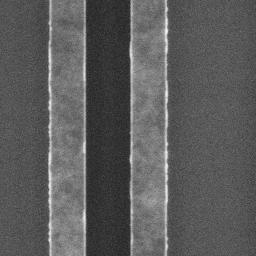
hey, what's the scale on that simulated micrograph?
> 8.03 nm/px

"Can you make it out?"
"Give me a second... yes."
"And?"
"lines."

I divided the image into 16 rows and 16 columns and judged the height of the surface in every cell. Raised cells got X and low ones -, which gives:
---XX---XX------
---XX---XX------
---XX---XX------
---XX---XX------
---XX---XX------
---XX---XX------
---XX---XX------
---XX---XX------
---XX---XX------
---XX---XX------
---XX---XX------
---XX---XX------
---XX---XX------
---XX---XX------
---XX---XX------
---XX---XX------